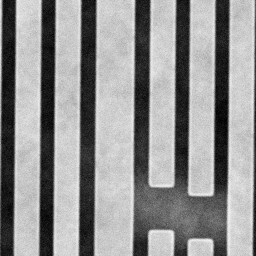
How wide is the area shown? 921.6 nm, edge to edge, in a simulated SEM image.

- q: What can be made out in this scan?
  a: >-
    groups of lines, slits or small figures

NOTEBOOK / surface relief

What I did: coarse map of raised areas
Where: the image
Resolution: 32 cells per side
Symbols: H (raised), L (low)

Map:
LLHHHLLHHHLLHHHHHLLHHHLLHHHLLHHH
LLHHHLLHHHLLHHHHHLLHHHLLHHHLLHHH
LLHHHLLHHHLLHHHHHLLHHHLLHHHLLHHH
LLHHHLLHHHLLHHHHHLLHHHLLHHHLLHHH
LLHHHLLHHHLLHHHHHLLHHHLLHHHLLHHH
LLHHHLLHHHLLHHHHHLLHHHLLHHHLLHHH
LLHHHLLHHHLLHHHHHLLHHHLLHHHLLHHH
LLHHHLLHHHLLHHHHHLLHHHLLHHHLLHHH
LLHHHLLHHHLLHHHHHLLHHHLLHHHLLHHH
LLHHHLLHHHLLHHHHHLLHHHLLHHHLLHHH
LLHHHLLHHHLLHHHHHLLHHHLLHHHLLHHH
LLHHHLLHHHLLHHHHHLLHHHLLHHHLLHHH
LLHHHLLHHHLLHHHHHLLHHHLLHHHLLHHH
LLHHHLLHHHLLHHHHHLLHHHLLHHHLLHHH
LLHHHLLHHHLLHHHHHLLHHHLLHHHLLHHH
LLHHHLLHHHLLHHHHHLLHHHLLHHHLLHHH
LLHHHLLHHHLLHHHHHLLHHHLLHHHLLHHH
LLHHHLLHHHLLHHHHHLLHHHLLHHHLLHHH
LLHHHLLHHHLLHHHHHLLHHHLLHHHLLHHH
LLHHHLLHHHLLHHHHHLLHHHLLHHHLLHHH
LLHHHLLHHHLLHHHHHLLHHHLLHHHLLHHH
LLHHHLLHHHLLHHHHHLLHHHLLHHHLLHHH
LLHHHLLHHHLLHHHHHLLHHHLLHHHLLHHH
LLHHHLLHHHLLHHHHHLLLLLLLHHHLLHHH
LLHHHLLHHHLLHHHHHLLLLLLLLLLLLHHH
LLHHHLLHHHLLHHHHHLLLLLLLLLLLLHHH
LLHHHLLHHHLLHHHHHLLLLLLLLLLLLHHH
LLHHHLLHHHLLHHHHHLLLLLLLLLLLLHHH
LLHHHLLHHHLLHHHHHLLLLLLLLLLLLHHH
LLHHHLLHHHLLHHHHHLLHHHLLLLLLLHHH
LLHHHLLHHHLLHHHHHLLHHHLLHHHLLHHH
LLHHHLLHHHLLHHHHHLLHHHLLHHHLLHHH